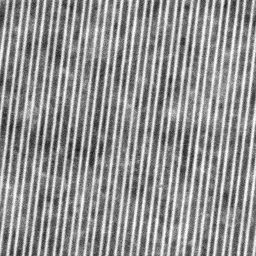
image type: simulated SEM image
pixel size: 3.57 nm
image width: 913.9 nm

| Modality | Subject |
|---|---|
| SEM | parallel lines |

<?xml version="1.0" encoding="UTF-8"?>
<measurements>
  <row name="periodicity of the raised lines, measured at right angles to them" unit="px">7.62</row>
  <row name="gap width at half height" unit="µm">0.019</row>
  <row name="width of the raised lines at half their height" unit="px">1.85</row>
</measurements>